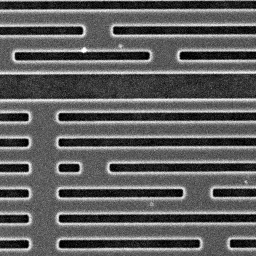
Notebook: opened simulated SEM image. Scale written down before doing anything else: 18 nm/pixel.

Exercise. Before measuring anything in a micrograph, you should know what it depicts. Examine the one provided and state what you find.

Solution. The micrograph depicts groups of lines, slits or small figures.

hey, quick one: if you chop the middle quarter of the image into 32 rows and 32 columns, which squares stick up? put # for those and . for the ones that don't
################################
################################
................................
................................
................................
................................
................................
................................
................................
################################
################################
################################
................................
................................
################################
################################
################################
################################
................................
................................
................................
################################
################################
################################
################################
....#######.....................
....#######.....................
################################
################################
################################
################################
..............................##